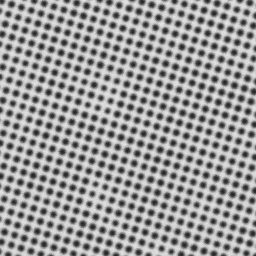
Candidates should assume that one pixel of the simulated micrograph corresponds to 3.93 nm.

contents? a regular array of holes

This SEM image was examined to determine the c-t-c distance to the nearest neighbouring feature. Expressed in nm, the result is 40.1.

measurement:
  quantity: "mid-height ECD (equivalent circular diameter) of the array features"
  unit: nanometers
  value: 29.8